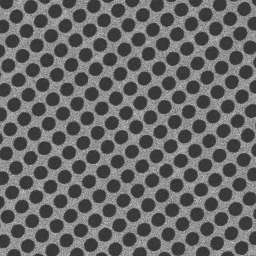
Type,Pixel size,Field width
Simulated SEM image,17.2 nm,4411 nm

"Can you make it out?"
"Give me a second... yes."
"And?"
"a regular array of holes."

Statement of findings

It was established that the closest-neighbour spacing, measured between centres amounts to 297 nm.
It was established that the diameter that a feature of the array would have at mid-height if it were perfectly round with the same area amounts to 241 nanometers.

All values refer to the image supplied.